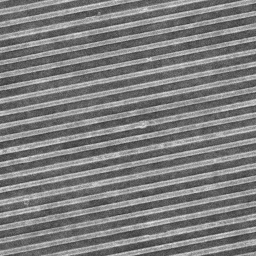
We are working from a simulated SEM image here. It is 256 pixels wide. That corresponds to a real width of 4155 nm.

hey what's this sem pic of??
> parallel lines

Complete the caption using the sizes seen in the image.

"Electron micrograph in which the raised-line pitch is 12.5 px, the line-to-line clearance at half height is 135 nm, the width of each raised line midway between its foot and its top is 75.7 nanometers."